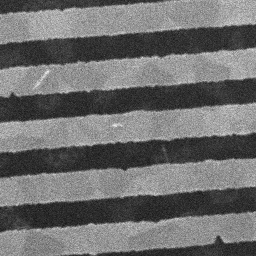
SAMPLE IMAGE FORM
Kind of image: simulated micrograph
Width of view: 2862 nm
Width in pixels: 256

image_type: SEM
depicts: parallel lines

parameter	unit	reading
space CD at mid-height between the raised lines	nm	291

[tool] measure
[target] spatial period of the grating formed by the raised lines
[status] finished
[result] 606 nm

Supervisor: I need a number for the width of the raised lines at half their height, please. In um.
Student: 0.309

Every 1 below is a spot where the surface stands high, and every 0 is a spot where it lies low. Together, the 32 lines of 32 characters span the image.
00000000001000000111111111111111
00000111111111111111111111111111
11111111111111111111111111111111
11111111111111111111111100000000
11111111111100000000000000000000
00000000000000000000000000000000
00000000000000000000000000011111
00000000000000111111111111111111
00111111111111111111111111111111
11111111111111111111111111111111
11111111111111111111110000000000
11111111100000000000000000000000
00000000000000000000000000000000
00000000000000000000000001111111
00000000000111111111111111111111
11111111111111111111111111111111
11111111111111111111111111111111
11111111111111111110000000000000
11111000000000000000000000000000
00000000000000000000000000000000
00000000000000000000000111111111
00000000001111111111111111111111
11111111111111111111111111111111
11111111111111111111111111110100
11111111111111110000000000000000
11100000000000000000000000000000
00000000000000000000000000000000
00000000000000000000011111111111
00110001111111111111111111111111
11111111111111111111111111111111
11111111111111111111111111000000
11111111111111000000000000000000